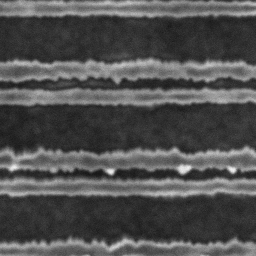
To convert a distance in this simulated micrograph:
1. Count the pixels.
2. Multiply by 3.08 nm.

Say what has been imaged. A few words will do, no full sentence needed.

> lines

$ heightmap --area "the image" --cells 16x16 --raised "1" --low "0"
1111111111111111
0000000000000000
0000000000000000
0000000000000000
1111111111111111
1111111111111111
0100000010000000
0000000000000000
0000000000000000
0000000000000001
1111111111111111
1111111111111111
0000000000000000
0000000000000000
0000000000000000
1111111111111111